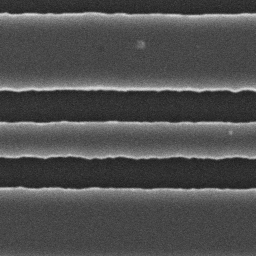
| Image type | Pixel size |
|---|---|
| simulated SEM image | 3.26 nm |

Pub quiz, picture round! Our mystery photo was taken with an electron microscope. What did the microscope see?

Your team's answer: lines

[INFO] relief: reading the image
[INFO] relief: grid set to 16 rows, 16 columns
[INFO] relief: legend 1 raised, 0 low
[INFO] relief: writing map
0000000000000000
1111111111111111
1111111111111111
1111111111111111
1111111111111111
1111111111111111
0000000000000000
0000000000000000
1111111111111111
1111111111111111
0000000000000000
0000000000000000
1111111111111111
1111111111111111
1111111111111111
1111111111111111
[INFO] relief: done